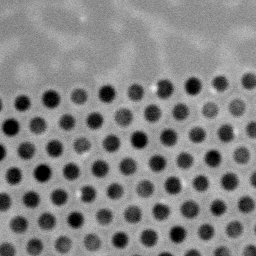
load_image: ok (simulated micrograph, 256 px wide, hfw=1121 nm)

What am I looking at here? a regular array of holes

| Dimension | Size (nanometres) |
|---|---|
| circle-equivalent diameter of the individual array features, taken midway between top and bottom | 80.8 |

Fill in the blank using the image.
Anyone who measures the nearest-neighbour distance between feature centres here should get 120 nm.